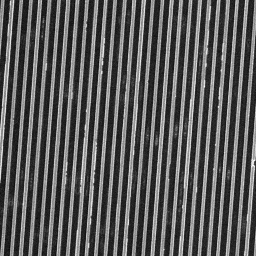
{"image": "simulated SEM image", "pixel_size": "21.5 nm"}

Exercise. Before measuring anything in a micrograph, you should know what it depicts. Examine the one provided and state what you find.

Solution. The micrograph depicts parallel lines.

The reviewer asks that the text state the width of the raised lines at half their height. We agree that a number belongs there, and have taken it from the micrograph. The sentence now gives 69.7 nanometers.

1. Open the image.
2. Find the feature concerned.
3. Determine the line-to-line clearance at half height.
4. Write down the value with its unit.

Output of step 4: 137 nanometers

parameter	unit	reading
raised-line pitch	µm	0.202